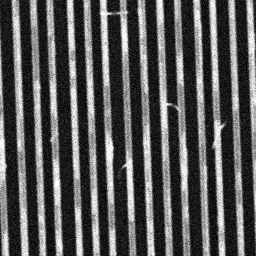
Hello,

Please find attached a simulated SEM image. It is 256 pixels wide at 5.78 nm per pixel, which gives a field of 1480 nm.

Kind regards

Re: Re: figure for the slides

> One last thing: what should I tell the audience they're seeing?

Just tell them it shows parallel lines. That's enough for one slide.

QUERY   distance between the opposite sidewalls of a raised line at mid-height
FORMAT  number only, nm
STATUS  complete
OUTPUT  34.6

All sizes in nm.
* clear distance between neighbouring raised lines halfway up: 69.3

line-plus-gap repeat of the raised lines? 104 nm